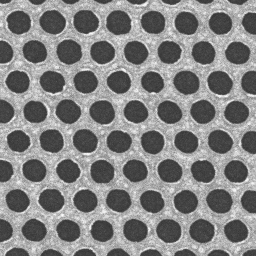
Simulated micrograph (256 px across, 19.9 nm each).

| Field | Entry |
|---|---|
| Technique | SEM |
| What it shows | a regular array of holes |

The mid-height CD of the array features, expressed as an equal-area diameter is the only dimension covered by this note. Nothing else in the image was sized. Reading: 485 nm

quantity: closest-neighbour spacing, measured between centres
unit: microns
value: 0.666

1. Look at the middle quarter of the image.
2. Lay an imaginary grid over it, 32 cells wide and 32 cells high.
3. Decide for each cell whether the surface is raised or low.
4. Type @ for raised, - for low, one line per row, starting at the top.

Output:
@@@@@@@@@@@@@@@@@@@@@@@@@@@@@@@@
@@@@@-@@@@@@@@@@@@@@@@@@@@@@@@@@
@@@-----@@@@----@@@@----@@@@----
@@------@@@------@@------@@-----
@@-------@@------@@------@@-----
@@@-----@@@------@@------@@@----
@@@-----@@@@----@@@@-----@@@----
@@@@@-@@@@@@@@@@@@@@@@@@@@@@@@--
@@@@@@@@@@@@@@@@@@@@@@@@@@@@@@@@
---@@@@@---@@@@@---@@@@@@---@@@@
----@@@-----@@@-----@@@------@@@
----@@-------@@------@@------@@@
----@@-------@@------@@-------@@
----@@@------@@------@@@-----@@@
---@@@@@----@@@@----@@@@@----@@@
@@@@@@@@@@@@@@@@@@@@@@@@@@@@@@@@
@@@@---@@@@@@-@@@@@@@@@@@@@@@@@@
@@@-----@@@-----@@@@----@@@@----
@@------@@@------@@------@@@----
@@-------@@------@@------@@-----
@@------@@@------@@------@@@----
@@@-----@@@@----@@@@----@@@@@---
@@@@@@@@@@@@@@@@@@@@@--@@@@@@@@-
@@@@@@@@@@@@@@@@@@@@@@@@@@@@@@@@
---@@@@@---@@@@@----@@@@----@@@@
----@@@-----@@@------@@------@@@
----@@@------@@------@@-------@@
----@@@------@@------@@@------@@
----@@@-----@@@@-----@@@-----@@@
---@@@@@---@@@@@@--@@@@@@---@@@@
@@@@@@@@@@@@@@@@@@@@@@@@@@@@@@@@
@@@@---@@@@@---@@@@@@-@@@@@@@@-@